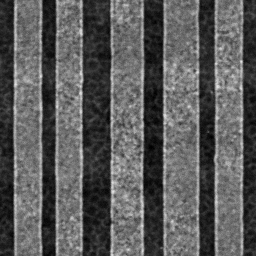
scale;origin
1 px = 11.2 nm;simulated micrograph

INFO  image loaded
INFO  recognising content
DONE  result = parallel lines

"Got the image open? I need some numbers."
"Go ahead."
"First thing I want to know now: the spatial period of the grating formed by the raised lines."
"566 nanometers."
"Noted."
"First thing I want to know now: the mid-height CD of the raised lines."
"288 nm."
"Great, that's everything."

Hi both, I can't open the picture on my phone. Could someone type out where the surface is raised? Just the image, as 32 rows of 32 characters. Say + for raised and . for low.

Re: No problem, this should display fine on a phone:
..+++..+++....++++...++++..+++..
..+++..+++....++++...++++..+++..
..+++..+++....++++...++++..+++..
..+++..+++....++++...++++..+++..
..+++..+++....++++...++++..+++..
..+++..+++....++++...++++..+++..
..+++..+++....++++...++++..+++..
..+++..+++....++++...++++..+++..
..+++..+++....++++...++++..+++..
..+++..+++....++++...++++..+++..
..+++..+++....++++...++++..+++..
..+++..+++....++++...++++..+++..
..+++..+++....++++...++++..+++..
..+++..+++....++++...++++..+++..
..+++..+++....++++...++++..+++..
..+++..+++....++++...++++..+++..
..+++..+++....++++...++++..+++..
..+++..+++....++++...++++..+++..
..+++..+++....++++...++++..+++..
..+++..+++....++++...++++..+++..
..+++..+++....++++...++++..+++..
..+++..+++....++++...++++..+++..
..+++..+++....++++...++++..+++..
..+++..+++....++++...++++..+++..
..+++..+++....++++...++++..+++..
..+++..+++....++++...++++..+++..
..+++..+++....++++...++++..+++..
..+++..+++....++++...++++..+++..
..+++..+++....++++...++++..+++..
..+++..+++....++++...++++..+++..
..+++..+++....++++...++++..+++..
..+++..+++....++++...++++..+++..